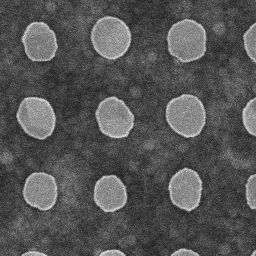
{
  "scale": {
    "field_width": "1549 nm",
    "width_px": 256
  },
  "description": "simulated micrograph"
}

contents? a regular array of raised bodies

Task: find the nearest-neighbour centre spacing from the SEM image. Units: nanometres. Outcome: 433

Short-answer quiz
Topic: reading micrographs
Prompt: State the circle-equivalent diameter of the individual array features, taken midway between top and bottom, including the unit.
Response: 38.1 px